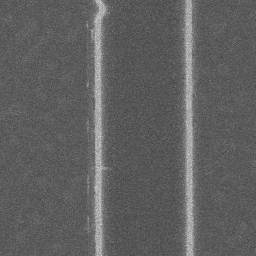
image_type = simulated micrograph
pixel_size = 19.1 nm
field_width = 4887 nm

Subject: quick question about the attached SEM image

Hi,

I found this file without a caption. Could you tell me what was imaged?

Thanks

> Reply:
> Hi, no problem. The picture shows one or a few lines or trenches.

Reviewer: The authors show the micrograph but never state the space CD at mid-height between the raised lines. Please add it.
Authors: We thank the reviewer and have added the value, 1.73 microns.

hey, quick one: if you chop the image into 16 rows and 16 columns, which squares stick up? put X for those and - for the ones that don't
XXXXXX------XXXX
XXXXXX------XXXX
XXXXXX------XXXX
XXXXXX------XXXX
XXXXXX------XXXX
XXXXXX------XXXX
XXXXXX------XXXX
XXXXXX------XXXX
XXXXXX------XXXX
XXXXXX------XXXX
XXXXXX------XXXX
XXXXXX------XXXX
XXXXXX------XXXX
XXXXXX------XXXX
XXXXXX------XXXX
XXXXXX------XXXX